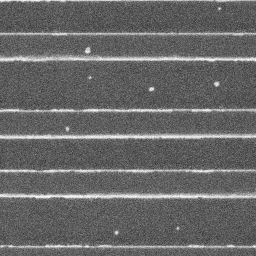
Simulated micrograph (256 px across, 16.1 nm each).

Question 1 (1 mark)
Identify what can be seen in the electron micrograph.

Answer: lines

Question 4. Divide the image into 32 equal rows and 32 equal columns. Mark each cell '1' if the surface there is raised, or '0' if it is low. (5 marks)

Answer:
00000000000000000000000000000000
00000000000000000000000000000000
00000000000000000000000000000000
00000000000000000000000000000000
11111111111111111111111111111111
11111111111111111111111111111111
11111111111111111111111111111111
00000000000000000000000000000000
00000000000000000000000000000000
00000000000000000000000000000000
00000000000000000000000000000000
00000000000000000000000000000000
00000000000000000000000000000000
00000000000000000000000000000000
11111111111111111111111111111111
11111111111111111111111111111111
11111111111111111111111111111111
00000000000000000000000000000000
00000000000000000000000000000000
00000000000000000000000000000000
00000000000000000000000000000000
11111111111111111111111111111111
11111111111111111111111111111111
11111111111111111111111111111111
11111111111111111111111111111111
00000000000000000000000000000000
00000000000000000000000000000000
00000000000000000000000000000000
00000000000000000000000000000000
00000000000000000000000000000000
00000000000000000000000000000000
11111111111111111111111111111111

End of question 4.